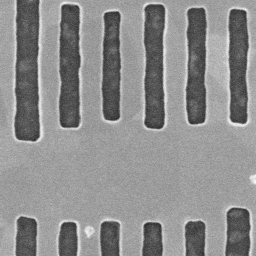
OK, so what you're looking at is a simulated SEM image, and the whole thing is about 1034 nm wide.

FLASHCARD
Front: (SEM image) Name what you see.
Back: holes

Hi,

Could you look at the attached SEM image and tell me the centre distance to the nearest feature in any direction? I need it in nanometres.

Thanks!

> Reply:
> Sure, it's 169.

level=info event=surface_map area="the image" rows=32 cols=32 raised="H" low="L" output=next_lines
HHLLLHHHLHHHHHHHHHHLHHHHHHHHHHHH
HHLLLHHHLLHHHHLHHHLLLHHLLLHHHLLH
HHLLLHHHLLHHHLLHHHLLLHHLLLHHLLLH
HHLLLHHLLLHHHLLHHHLLLHHLLLHHLLLH
HHLLLHHLLLHHHLLHHHLLHHHLLLHHLLLH
HHLLLHHLLLHHHLLHHHLLHHHLLLHHHLLH
HHLLLHHLLLHHHLLHHHLLHHHLLLHHLLLH
HHLLLHHLLLHHHLLHHHLLHHHLLLHHHLLH
HHLLLHHLLLHHHLLHHHLLLHHLLLHHHLLH
HHLLLHHLLLHHHLLHHHLLLHHLLLHHHLLH
HHLLLHHHLLHHHLLHHHLLLHHLLLHHHLLH
HHLLLHHLLLHHHLLHHHLLLHHLLLHHHLLH
HHLLLHHLLLHHHLLHHHLLLHHLLLHHHLLH
HHLLLHHLLLHHHLLHHHLLLHHLLLHHHLLH
HHLLLHHLLLHHHLLHHHLLLHHLLLHHHLLH
HHLLLHHHLLHHHHHHHHLLLHHHLHHHHHHH
HHLLLHHHHHHHHHHHHHHHHHHHHHHHHHHH
HHLLLHHHHHHHHHHHHHHHHHHHHHHHHHHH
HHHHHHHHHHHHHHHHHHHHHHHHHHHHHHHH
HHHHHHHHHHHHHHHHHHHHHHHHHHHHHHHH
HHHHHHHHHHHHHHHHHHHHHHHHHHHHHHHH
HHHHHHHHHHHHHHHHHHHHHHHHHHHHHHHH
HHHHHHHHHHHHHHHHHHHHHHHHHHHHHHHH
HHHHHHHHHHHHHHHHHHHHHHHHHHHHHHHH
HHHHHHHHHHHHHHHHHHHHHHHHHHHHHHHH
HHHHHHHHHHHHHHHHHHHHHHHHHHHHHHHH
HHHHHHHHHHHHHHHHHHHHHHHHHHHHLLLH
HHLLHHHHHHHHHLHHHHHHHHHHHHHHLLLH
HHLLLHHHLLHHLLLHHHLLHHHLLLHHLLLH
HHLLLHHLLLHHLLLHHHLLHHHLLLHHLLLH
HHLLLHHLLLHHLLLHHHLLHHHLLLHHLLLH
HHLLLHHLLLHHHLLHHHLLHHHLLLHHLLLH